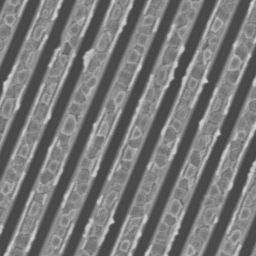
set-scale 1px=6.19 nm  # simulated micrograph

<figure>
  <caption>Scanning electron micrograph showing parallel lines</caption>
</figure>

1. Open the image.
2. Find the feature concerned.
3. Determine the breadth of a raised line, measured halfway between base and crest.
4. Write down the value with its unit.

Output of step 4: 126 nanometres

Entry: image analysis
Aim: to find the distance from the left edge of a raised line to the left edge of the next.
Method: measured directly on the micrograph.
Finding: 0.201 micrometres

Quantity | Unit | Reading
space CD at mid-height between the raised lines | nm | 73.4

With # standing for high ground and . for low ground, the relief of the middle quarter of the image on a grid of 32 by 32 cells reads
##...#####....#####....#####...#
#....#####....#####...######...#
#...######...#####....#####...##
....#####....#####...######...##
...######...######...######..###
...#####....#####....#####...###
...#####....#####...#####....###
..#####....#####....#####....###
..#####....#####...######...####
.######...#####....#####....####
.#####....#####...######...#####
######...######...#####....#####
#####....#####....#####...######
#####....#####...#####....#####.
####....#####....#####....#####.
####...######...######...#####..
####...######...#####...######..
###....#####....#####...######..
###...######...#####....#####...
##....#####....#####...######...
##....#####...######...#####....
#....#####....#####....#####....
#....#####...######...######...#
#...######...#####....#####....#
....#####....#####...######...##
....#####...#####....#####....##
...#####....#####....#####...###
...#####...######...#####....###
..######...#####....#####....###
..#####....#####...#####....####
.######...#####....#####....####
.#####....#####...######...#####